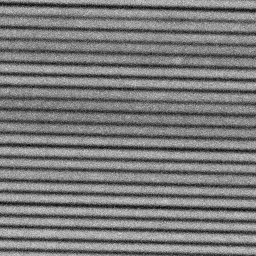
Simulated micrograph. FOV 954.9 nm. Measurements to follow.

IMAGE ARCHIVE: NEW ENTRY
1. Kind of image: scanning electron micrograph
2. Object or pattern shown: parallel lines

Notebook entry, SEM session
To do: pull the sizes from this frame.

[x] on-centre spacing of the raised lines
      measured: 0.0437 um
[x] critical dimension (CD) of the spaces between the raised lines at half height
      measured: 10.7 nm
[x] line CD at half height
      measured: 32.2 nm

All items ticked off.